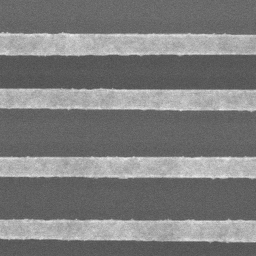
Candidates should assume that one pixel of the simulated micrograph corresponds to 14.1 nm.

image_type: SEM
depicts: lines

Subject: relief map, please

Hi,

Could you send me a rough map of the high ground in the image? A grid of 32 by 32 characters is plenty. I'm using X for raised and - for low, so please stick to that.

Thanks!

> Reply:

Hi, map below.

--------------------------------
--------------------------------
--------------------------------
--------------------------------
XXXXXXXXXXXXXXXXXXXXXXXXXXXXXXXX
XXXXXXXXXXXXXXXXXXXXXXXXXXXXXXXX
XXXXXXXXXXXXXXXXXXXXXXXXXXXXXXXX
--------------------------------
--------------------------------
--------------------------------
--------------------------------
XXXXXXXXXXXXXXXXXXXXXXXXXXXXXXXX
XXXXXXXXXXXXXXXXXXXXXXXXXXXXXXXX
------XX--XXXXXXXXXXXXXXXXXXXXXX
--------------------------------
--------------------------------
--------------------------------
--------------------------------
--------------------------------
--------------------------------
XXXXXXXXXXXXXXXXXXXXXXXXXXXXXXXX
XXXXXXXXXXXXXXXXXXXXXXXXXXXXXXXX
--------------------------------
--------------------------------
--------------------------------
--------------------------------
--------------------------------
--------------------------------
XXXXXXXXXXXXXXXXXXXXXXXXXXXXXXXX
XXXXXXXXXXXXXXXXXXXXXXXXXXXXXXXX
--------------------------------
--------------------------------